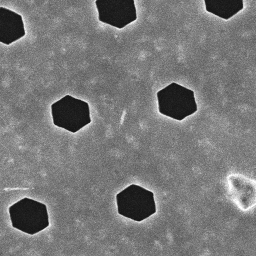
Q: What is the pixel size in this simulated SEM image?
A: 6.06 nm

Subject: holes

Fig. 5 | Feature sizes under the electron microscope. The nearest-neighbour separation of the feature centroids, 0.649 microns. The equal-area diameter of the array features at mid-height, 37.1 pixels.